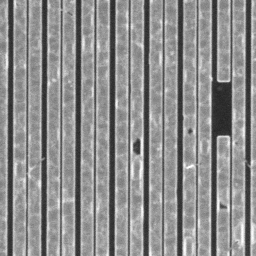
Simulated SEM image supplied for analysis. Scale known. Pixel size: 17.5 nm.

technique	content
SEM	parallel lines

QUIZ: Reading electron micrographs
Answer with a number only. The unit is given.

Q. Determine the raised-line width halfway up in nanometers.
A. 221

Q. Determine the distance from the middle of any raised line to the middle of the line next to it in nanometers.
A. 294